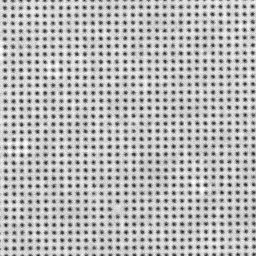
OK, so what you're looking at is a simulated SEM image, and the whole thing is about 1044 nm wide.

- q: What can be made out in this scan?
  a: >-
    a regular array of holes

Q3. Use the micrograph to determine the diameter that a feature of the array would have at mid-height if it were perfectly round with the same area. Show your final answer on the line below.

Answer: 16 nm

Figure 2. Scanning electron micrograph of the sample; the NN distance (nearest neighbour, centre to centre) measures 31.1 nm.